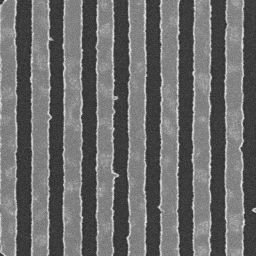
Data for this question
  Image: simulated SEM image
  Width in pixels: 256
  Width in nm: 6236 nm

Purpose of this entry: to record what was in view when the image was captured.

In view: parallel lines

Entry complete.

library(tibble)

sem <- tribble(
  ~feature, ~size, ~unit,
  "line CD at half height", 408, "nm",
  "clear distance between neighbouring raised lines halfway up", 384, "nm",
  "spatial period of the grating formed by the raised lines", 787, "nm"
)